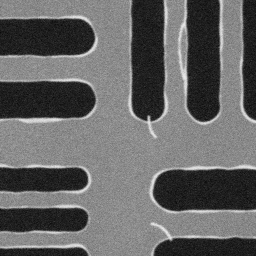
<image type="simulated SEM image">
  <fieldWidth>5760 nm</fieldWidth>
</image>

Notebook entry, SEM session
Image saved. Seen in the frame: groups of lines, slits or small figures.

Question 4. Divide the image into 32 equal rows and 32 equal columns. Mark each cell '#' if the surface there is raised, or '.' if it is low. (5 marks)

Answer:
################.....##.....##..
################.....##.....##..
...........#####.....##.....##..
............####.....##.....##..
............####.....##.....##..
............####.....##.....##..
...........#####.....##.....##..
################.....##.....##..
################.....##.....##..
################.....##.....##..
...........#####.....##.....##..
............####.....##....###..
............####.....##....###..
............####.....##.....##..
...........######...####...####.
################################
################################
################################
################################
################################
################################
...........#########............
...........########.............
...........########.............
###################.............
####################............
...........#####################
...........#####################
...........#####################
################################
####################............
...........########.............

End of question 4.